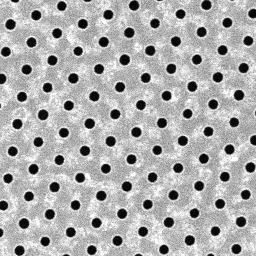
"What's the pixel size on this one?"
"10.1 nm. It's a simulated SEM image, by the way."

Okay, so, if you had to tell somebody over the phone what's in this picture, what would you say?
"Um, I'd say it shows a regular array of holes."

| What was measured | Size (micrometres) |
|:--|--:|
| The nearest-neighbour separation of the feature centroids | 0.275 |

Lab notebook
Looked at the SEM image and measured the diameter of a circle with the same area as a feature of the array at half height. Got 103 nanometres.